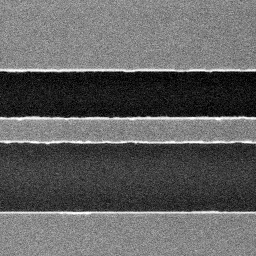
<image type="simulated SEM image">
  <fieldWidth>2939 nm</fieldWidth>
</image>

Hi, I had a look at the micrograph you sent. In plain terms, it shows lines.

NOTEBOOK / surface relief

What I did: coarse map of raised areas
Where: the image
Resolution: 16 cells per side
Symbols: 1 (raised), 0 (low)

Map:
1111111111111111
1111111111111111
1111111111111111
1111111111111111
0000000000000000
0000000000000000
0000000000000000
1111111111111111
1111111111111111
0000000000000000
0000000000000000
0000000000000000
0000000000000000
1111111111111111
1111111111111111
1111111111111111